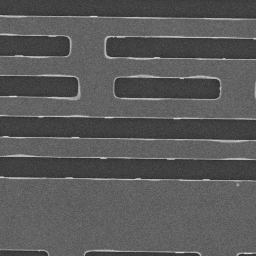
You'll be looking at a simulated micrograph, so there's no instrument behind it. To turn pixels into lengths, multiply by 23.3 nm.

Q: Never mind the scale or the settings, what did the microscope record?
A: groups of lines, slits or small figures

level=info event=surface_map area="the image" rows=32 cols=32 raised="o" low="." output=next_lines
................................
................................
oooooooooooooooooooooooooooooooo
oooooooooooooooooooooooooooooooo
........oooooooooooooooooooooooo
.........oooo...................
.........oooo...................
ooooooooooooooooooooooooooooooo.
oooooooooooooooooooooooooooooooo
.........oooooooo..ooooooooooooo
..........oooo.............ooooo
..........oooo..............oooo
oooooooooooooooooooooooooooooooo
oooooooooooooooooooooooooooooooo
..oooooooooooooooooooooooooooooo
................................
................................
oooooooooooooooooo.oo...........
oooooooooooooooooooooooooooooooo
....oooooooooooooooooooooooooooo
................................
................................
ooooooooooooooooooo.............
oooooooooooooooooooooooooooooooo
oooooooooooooooooooooooooooooooo
oooooooooooooooooooooooooooooooo
oooooooooooooooooooooooooooooooo
oooooooooooooooooooooooooooooooo
oooooooooooooooooooooooooooooooo
oooooooooooooooooooooooooooooooo
oooooooooooooooooooooooooooooooo
......ooooo.............oooooooo